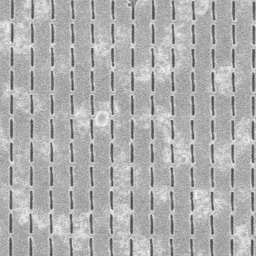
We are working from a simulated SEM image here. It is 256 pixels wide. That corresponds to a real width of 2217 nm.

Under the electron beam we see a regular array of holes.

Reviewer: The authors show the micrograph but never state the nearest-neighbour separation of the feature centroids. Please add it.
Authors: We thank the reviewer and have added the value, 172 nm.